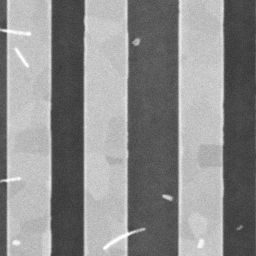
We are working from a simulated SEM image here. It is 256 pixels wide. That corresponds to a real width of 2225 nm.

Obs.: lines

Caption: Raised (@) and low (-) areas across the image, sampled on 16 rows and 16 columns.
@@@--@@@---@@@--
@@@--@@@---@@@--
@@@--@@@---@@@--
@@@--@@@---@@@--
@@@--@@@---@@@--
@@@--@@@---@@@--
@@@--@@@---@@@--
@@@--@@@---@@@--
@@@--@@@---@@@--
@@@--@@@---@@@--
@@@--@@@---@@@--
@@@--@@@---@@@--
@@@--@@@---@@@--
@@@--@@@---@@@--
@@@--@@@---@@@--
@@@--@@@---@@@--